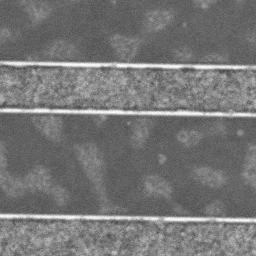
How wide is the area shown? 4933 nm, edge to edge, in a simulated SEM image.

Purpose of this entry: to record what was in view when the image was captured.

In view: one or a few lines or trenches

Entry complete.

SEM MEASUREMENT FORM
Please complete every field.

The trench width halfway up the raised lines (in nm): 2030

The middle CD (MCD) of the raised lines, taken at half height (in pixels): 47.2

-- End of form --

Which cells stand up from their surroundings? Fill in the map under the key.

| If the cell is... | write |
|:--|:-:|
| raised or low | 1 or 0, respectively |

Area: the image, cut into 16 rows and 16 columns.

0000000000000000
0000000000000000
0000000000000000
0000000000000000
1111111111111111
1111111111111111
1111111111111111
0000000000000000
0000000000000000
0000000000000000
0000000000000000
0000000000000000
0000000000000000
0000000000000000
1111111111111111
1111111111111111